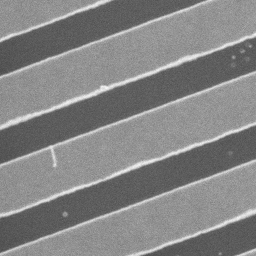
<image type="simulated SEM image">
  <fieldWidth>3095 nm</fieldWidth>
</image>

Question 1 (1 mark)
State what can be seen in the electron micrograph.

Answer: lines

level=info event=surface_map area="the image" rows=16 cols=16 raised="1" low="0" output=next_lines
1111110000001111
1110000001111111
0000001111111110
0001111111111000
0111111111000000
1111111000000111
1111000000111111
1100000011111111
0000011111111100
0011111111100000
1111111110000001
1111110000001111
1110000001111111
0000001111111111
0000111111111000
0111111111000000